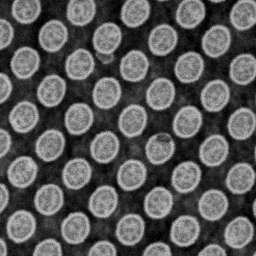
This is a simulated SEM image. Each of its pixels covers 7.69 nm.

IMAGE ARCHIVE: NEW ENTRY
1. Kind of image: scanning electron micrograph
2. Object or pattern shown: a regular array of raised bodies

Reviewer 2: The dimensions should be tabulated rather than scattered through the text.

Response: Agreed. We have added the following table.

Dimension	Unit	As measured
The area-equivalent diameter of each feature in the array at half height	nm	211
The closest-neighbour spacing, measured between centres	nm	294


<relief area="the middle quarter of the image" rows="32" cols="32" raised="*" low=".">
.******.......*******.......****
.******.......*******.......****
.*****.........*****........****
..***..........****..........***
.........****..........***......
........******........*****.....
........******.......******.....
........******.......******.....
........*****........******.....
........*****........******.....
...**....***..........****......
.*****.........*****..........**
.******........*****.........***
.******.......******........****
.******.......******........****
.*****........******........****
.****.........*****.........****
..........**...***..........****
........*****.........*.........
........*****........***........
.......******........******.....
.......******........******.....
.......******........******.....
........****.........*****......
..***...........**....***.......
.*****.........*****.........***
******........******........****
******........******........****
******........******.......*****
******........******.......*****
.***...........****.........****
........****...........**....**.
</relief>